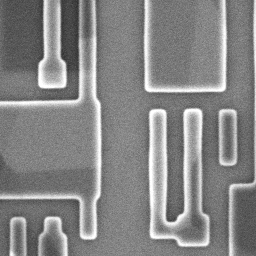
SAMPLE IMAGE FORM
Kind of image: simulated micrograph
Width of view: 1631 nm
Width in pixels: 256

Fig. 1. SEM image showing wiring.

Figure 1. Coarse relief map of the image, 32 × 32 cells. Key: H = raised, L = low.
LLLLLLHHLLHHLLLLLLHHHHHHHHHHLLLL
LLLLLLHHLLHHLLLLLLHHHHHHHHHHLLLL
LLLLLLHHLLHHLLLLLLHHHHHHHHHHLLLL
LLLLLLHHLLHHLLLLLLHHHHHHHHHHLLLL
LLLLLLHHLLHHLLLLLLHHHHHHHHHHLLLL
LLLLLLHHLLHHLLLLLLHHHHHHHHHHLLLL
LLLLLLHHLLHHLLLLLLHHHHHHHHHHLLLL
LLLLLHHHLLHHLLLLLLHHHHHHHHHHLLLL
LLLLLHHHLLHHLLLLLLHHHHHHHHHHLLLL
LLLLLHHHLLHHLLLLLLHHHHHHHHHHLLLL
LLLLLHHHLLHHLLLLLLHHHHHHHHHHLLLL
LLLLLLLLLLHHLLLLLLLLLLLLLLLLLLLL
LLLLLLLLLHHHLLLLLLLLLLLLLLLLLLLL
HHHHHHHHHHHHLLLLLLLLLLLLLLLLLLLL
HHHHHHHHHHHHLLLLLLLHHLLHHLLHHHLL
HHHHHHHHHHHHLLLLLLLHHLLHHLLHHHLL
HHHHHHHHHHHHLLLLLLLHHLLHHLLHHHLL
HHHHHHHHHHHHHLLLLLLHHLLHHLLHHHLL
HHHHHHHHHHHHHLLLLLLHHLLHHLLLHHLL
HHHHHHHHHHHHHLLLLLLHHLLHHLLLHHLL
HHHHHHHHHHHHHLLLLLLHHLLHHLLLHLLL
HHHHHHHHHHHHLLLLLLLHHLLHHLLLLLLL
HHHHHHHHHHHHLLLLLLLHHLLHHLLLLLLL
HHHHHHHHHHHHLLLLLLLHHLLHHLLLLHHH
HHHHHHHHHHHHLLLLLLLHHLLHHLLLLHHH
LLLLLLLLLLHHLLLLLLLHHLLHHLLLLHHH
LLLLLLLLLLHHLLLLLLLHHLLHHLLLLHHH
LHHLLLHLLLHHLLLLLLLHHLHHHHLLLHHH
LHHLLLHHLLHHLLLLLLLHHHHHHHLLLHHH
LHHLLHHHLLHHLLLLLLLHHHHHHHLLLHHH
LHHLLHHHLLLLLLLLLLLLLLHHHHLLLHHH
LHHLLHHHLLLLLLLLLLLLLLLLLLLLLHHH